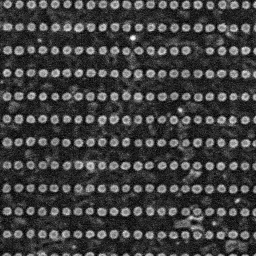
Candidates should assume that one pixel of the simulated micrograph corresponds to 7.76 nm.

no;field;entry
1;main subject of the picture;a regular array of raised bodies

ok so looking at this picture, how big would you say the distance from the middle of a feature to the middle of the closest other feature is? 89.8 nm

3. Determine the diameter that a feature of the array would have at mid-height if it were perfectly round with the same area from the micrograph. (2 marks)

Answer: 56.7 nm